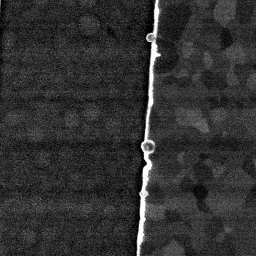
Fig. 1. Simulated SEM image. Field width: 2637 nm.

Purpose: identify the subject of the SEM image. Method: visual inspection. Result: one or a few lines or trenches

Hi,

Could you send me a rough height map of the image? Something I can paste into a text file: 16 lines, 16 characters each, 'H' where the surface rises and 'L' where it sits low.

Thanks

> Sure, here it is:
LLLLLLLLLLHHHHHH
LLLLLLLLLLHHHHHH
LLLLLLLLLHHHHHHH
LLLLLLLLLHHHHHHH
LLLLLLLLLHHHHHHH
LLLLLLLLLHHHHHHH
LLLLLLLLLHHHHHHH
LLLLLLLLLHHHHHHH
LLLLLLLLLHHHHHHH
LLLLLLLLLHHHHHHH
LLLLLLLLLHHHHHHH
LLLLLLLLLHHHHHHH
LLLLLLLLLHHHHHHH
LLLLLLLLLHHHHHHH
LLLLLLLLLHHHHHHH
LLLLLLLLLHHHHHHH